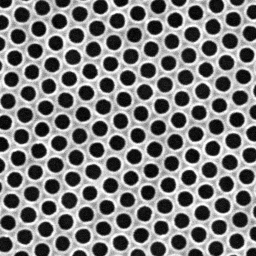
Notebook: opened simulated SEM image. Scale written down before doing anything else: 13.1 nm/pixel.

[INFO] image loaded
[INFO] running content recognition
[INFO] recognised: a regular array of holes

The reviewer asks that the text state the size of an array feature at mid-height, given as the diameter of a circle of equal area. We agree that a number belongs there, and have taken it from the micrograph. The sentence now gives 215 nm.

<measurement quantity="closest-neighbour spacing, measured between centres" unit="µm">0.282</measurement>